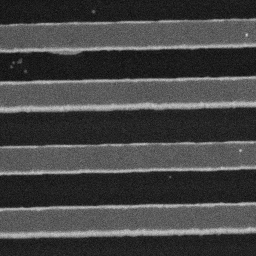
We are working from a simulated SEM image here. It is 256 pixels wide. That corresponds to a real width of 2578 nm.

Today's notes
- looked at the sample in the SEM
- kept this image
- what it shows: lines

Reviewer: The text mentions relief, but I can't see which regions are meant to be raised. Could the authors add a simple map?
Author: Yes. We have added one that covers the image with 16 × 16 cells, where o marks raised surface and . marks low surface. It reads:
................
..oooooooooooooo
oooooooooooooooo
................
................
oooooooooooooooo
oooooooooooooooo
................
................
oooooooooooooooo
oooooooooooooooo
................
................
oooooooooooooooo
oooooooooooooooo
................